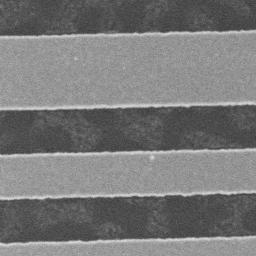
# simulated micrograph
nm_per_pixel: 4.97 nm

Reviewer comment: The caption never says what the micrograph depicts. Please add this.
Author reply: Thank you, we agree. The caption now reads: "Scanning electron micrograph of lines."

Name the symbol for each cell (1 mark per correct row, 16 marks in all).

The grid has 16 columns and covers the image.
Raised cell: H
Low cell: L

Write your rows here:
LLLLLLLLLLLLLLLL
LLLLLLLLLLLLLLLL
HHHHHHHHHHHHHHHH
HHHHHHHHHHHHHHHH
HHHHHHHHHHHHHHHH
HHHHHHHHHHHHHHHH
HHHHHHHHHHHHHHHH
LLLLLLLLLLLLLLLL
LLLLLLLLLLLLLLLL
LLLLLLLLHHHHHHHH
HHHHHHHHHHHHHHHH
HHHHHHHHHHHHHHHH
LLLLLLLLLLLLLLLL
LLLLLLLLLLLLLLLL
LLLLLLLLLLLLLLLL
HHHHHHHHHHHHHHHH